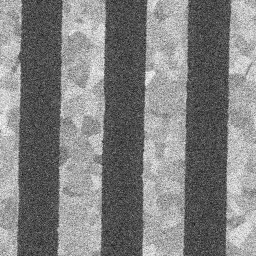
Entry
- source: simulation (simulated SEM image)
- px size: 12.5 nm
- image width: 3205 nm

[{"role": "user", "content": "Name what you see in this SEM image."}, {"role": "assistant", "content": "one or a few lines or trenches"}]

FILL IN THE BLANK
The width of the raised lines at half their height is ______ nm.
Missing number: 524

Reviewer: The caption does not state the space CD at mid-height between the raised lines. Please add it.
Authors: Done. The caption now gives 520 nanometres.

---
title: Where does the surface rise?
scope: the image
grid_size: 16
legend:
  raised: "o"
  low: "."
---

o...ooo..ooo..oo
o...ooo..ooo..oo
o...ooo..ooo..oo
o...ooo..ooo..oo
o...oo...ooo..oo
o...oo...ooo..oo
o...ooo..ooo..oo
o...ooo..ooo..oo
o...oo...ooo..oo
o...oo...ooo..oo
o...oo...ooo..oo
o...oo...ooo..oo
o...oo...ooo..oo
o...oo...ooo..oo
o...oo...oo...oo
o...oo...oo...oo